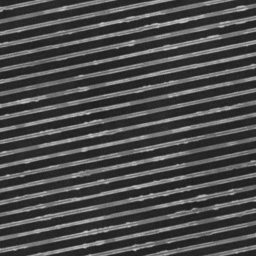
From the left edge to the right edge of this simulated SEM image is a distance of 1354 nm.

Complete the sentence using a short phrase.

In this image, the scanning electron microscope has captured parallel lines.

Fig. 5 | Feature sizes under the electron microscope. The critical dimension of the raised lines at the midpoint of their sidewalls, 18.8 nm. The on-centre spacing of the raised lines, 62.5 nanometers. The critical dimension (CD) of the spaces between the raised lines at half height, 41.4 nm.